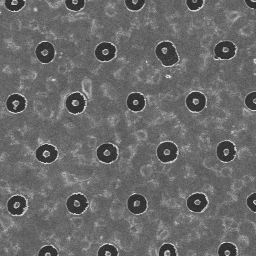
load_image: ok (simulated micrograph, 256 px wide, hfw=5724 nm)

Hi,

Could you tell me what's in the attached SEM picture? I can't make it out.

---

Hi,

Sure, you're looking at a regular array of ring-shaped grooves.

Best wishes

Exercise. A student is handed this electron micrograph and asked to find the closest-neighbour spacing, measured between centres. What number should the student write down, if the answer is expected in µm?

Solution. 1.3